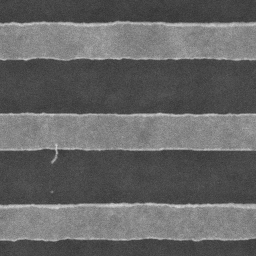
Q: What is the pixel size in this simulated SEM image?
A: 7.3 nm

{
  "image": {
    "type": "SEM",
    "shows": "lines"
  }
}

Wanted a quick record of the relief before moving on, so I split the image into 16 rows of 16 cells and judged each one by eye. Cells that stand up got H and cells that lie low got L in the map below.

LLLLLLLLLLLLLLLL
HHHHHHHHHHHLHLHH
HHHHHHHHHHHHHHHH
HHHHHHHHHHHHHHHH
LLLLLLLLLLLLLLLL
LLLLLLLLLLLLLLLL
LLLLLLLLLLLLLLLL
HHHHHHHHHHHHHHHH
HHHHHHHHHHHHHHHH
LLLLLLLLLLLLLLLL
LLLLLLLLLLLLLLLL
LLLLLLLLLLLLLLLL
LLLLLLLLLLLLLLLL
HHHHHHHHHHHHHHHH
HHHHHHHHHHHHHHHH
LLLLLLLLLLLLLLLL